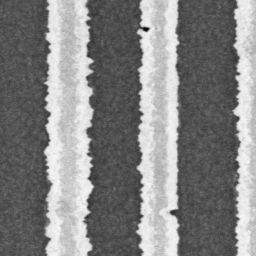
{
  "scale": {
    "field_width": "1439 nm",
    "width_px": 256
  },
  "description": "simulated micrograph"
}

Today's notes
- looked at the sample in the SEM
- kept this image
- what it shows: one or a few lines or trenches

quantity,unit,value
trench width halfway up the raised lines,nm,379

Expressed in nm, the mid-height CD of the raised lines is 160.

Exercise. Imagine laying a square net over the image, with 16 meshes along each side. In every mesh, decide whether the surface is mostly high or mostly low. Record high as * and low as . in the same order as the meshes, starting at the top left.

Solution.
...**....**....*
...**....**....*
...**....**....*
...**....**....*
...**....**....*
...**....**....*
...**....**....*
...**....**....*
...**....**....*
...**....**....*
...**....**....*
...**....**....*
...**....**....*
...**....**....*
...**....**....*
...**....**....*